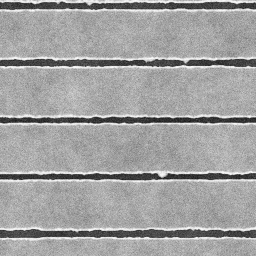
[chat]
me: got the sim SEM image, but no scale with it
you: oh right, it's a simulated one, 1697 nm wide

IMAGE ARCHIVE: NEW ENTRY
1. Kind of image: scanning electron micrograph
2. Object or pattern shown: lines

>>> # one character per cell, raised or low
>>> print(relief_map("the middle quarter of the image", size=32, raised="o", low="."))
.............................o..
oooooooooooooooooooooooooooooooo
oooooooooooooooooooooooooooooooo
oooooooooooooooooooooooooooooooo
oooooooooooooooooooooooooooooooo
oooooooooooooooooooooooooooooooo
oooooooooooooooooooooooooooooooo
oooooooooooooooooooooooooooooooo
oooooooooooooooooooooooooooooooo
oooooooooooooooooooooooooooooooo
oooooooooooooooooooooooooooooooo
oooooooooooooooooooooooooooooooo
oooooooooooooooooooooooooooooooo
................................
................................
oooooooooooooooooooooooooooooooo
oooooooooooooooooooooooooooooooo
oooooooooooooooooooooooooooooooo
oooooooooooooooooooooooooooooooo
oooooooooooooooooooooooooooooooo
oooooooooooooooooooooooooooooooo
oooooooooooooooooooooooooooooooo
oooooooooooooooooooooooooooooooo
oooooooooooooooooooooooooooooooo
oooooooooooooooooooooooooooooooo
oooooooooooooooooooooooooooooooo
oooooooooooooooooooooooooooooooo
....oo.....o............oo......
................................
oooooooooooooooooooooooooooooooo
oooooooooooooooooooooooooooooooo
oooooooooooooooooooooooooooooooo